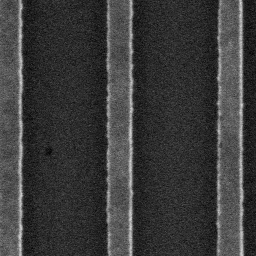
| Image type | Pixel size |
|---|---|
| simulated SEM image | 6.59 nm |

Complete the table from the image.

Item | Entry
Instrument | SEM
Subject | lines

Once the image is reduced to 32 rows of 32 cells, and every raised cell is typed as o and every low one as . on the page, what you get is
ooo..........ooo............oo..
ooo..........oooo..........ooo..
ooo..........ooo...........ooo..
ooo..........ooo...........ooo..
ooo..........ooo...........ooo..
ooo..........ooo...........ooo..
ooo..........oooo..........ooo..
ooo..........ooo...........ooo..
ooo..........ooo...........ooo..
ooo...........ooo..........ooo..
ooo..........oooo..........ooo..
ooo..........ooo...........ooo..
ooo..........ooo...........ooo..
ooo..........oooo..........ooo..
ooo..........ooo...........ooo..
ooo..........ooo...........ooo..
ooo..........ooo...........ooo..
ooo...........oo...........ooo..
ooo...........ooo..........ooo..
ooo..........ooo...........ooo..
ooo..........ooo...........ooo..
ooo..........ooo...........ooo..
ooo..........ooo...........ooo..
ooo..........ooo...........ooo..
ooo..........oooo..........ooo..
ooo..........ooo...........ooo..
ooo..........ooo...........ooo..
ooo..........ooo...........ooo..
ooo...........oo...........ooo..
ooo...........oo...........ooo..
ooo..........ooo...........ooo..
ooo...........oo...........ooo..